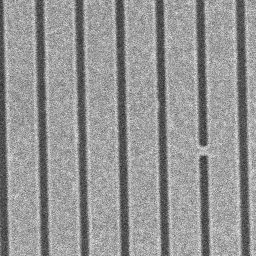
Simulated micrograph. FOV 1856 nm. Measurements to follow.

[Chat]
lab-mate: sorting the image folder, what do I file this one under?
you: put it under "parallel lines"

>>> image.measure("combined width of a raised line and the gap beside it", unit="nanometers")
291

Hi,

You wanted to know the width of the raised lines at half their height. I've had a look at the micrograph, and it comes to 215 nanometers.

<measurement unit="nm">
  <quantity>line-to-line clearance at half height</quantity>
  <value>74.3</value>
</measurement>